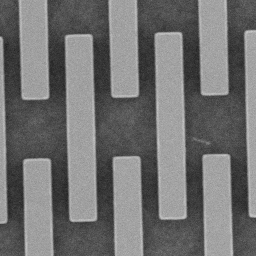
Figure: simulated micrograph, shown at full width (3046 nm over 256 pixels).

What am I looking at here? groups of lines, slits or small figures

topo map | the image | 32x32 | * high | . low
...***........***........***....
...***........***........***....
...***........***........***....
...***........***........***....
...***...**...***...***..***...*
...***..****..***..****..***...*
...***..****..***..****..***...*
...***..****..***..****..***...*
...***..****..***..****..***...*
...***..****..***...***..***...*
...***..****..***...***..***...*
...***..****..***...***..***...*
........****........***........*
........****........***........*
........****........***........*
*.......****........***........*
*........***........***........*
*........***........***........*
*........***........***........*
*........***........***...**...*
*..***...***..***...***..****..*
*..***...***..****..***..****..*
*..***...***..****..***...***..*
*..***...***..****..***...***..*
*..***...***..****..***...***..*
*..***...***..****..***...***..*
*..***...***..****..***...***..*
*..***...***..****........***...
...***........****........***...
...***........****........***...
...***........****........***...
...***........****........***...